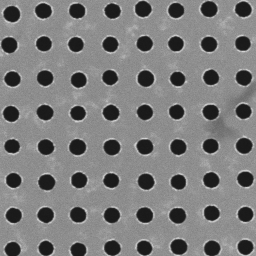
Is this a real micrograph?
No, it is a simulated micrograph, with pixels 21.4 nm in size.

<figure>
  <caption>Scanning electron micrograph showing a regular array of holes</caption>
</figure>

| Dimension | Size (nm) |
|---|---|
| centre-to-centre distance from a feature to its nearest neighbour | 694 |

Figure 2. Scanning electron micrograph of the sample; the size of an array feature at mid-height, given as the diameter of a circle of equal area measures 345 nm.